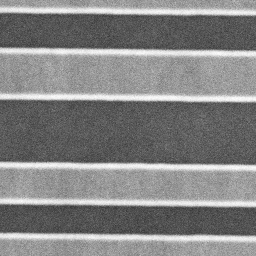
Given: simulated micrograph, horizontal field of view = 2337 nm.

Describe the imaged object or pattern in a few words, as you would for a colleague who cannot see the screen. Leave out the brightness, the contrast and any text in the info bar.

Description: groups of lines, slits or small figures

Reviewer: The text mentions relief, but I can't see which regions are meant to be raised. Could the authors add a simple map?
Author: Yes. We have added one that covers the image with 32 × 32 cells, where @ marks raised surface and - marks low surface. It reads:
@@@@@@@@@@@@@@@@@@@@@@@@@@@@@@@@
--------------@@@@@@@@@@@@@@@@@@
--------------------------------
--------------------------------
--------------------------------
--------------------------------
@@@@@@@@@@@@@@@@@@--------------
@@@@@@@@@@@@@@@@@@@@@@@@@@@@@@@@
@@@@@@@@@@@@@@@@@@@@@@@@@@@@@@@@
@@@@@@@@@@@@@@@@@@@@@@@@@@@@@@@@
@@@@@@@@@@@@@@@@@@@@@@@@@@@@@@@@
@@@@@@@@@@@@@@@@@@@@@@@@@@@@@@@@
-----------------------------@@@
--------------------------------
--------------------------------
--------------------------------
--------------------------------
--------------------------------
--------------------------------
--------------------------------
--------------------------------
@@@@@@@@@@@@@@@@@@@@@@@@@@@@@@@@
@@@@@@@@@@@@@@@@@@@@@@@@@@@@@@@@
@@@@@@@@@@@@@@@@@@@@@@@@@@@@@@@@
@@@@@@@@@@@@@@@@@@@@@@@@@@@@@@@@
-----------------------@@@@@@@@@
--------------------------------
--------------------------------
--------------------------------
@@@@@@@@@@@---------------------
@@@@@@@@@@@@@@@@@@@@@@@@@@@@@@@@
@@@@@@@@@@@@@@@@@@@@@@@@@@@@@@@@